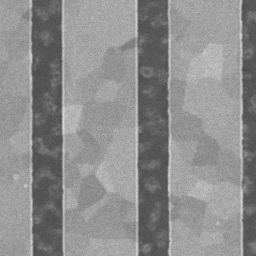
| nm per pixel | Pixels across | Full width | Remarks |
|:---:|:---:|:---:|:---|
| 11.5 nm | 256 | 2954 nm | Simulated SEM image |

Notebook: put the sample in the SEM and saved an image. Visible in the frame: one or a few lines or trenches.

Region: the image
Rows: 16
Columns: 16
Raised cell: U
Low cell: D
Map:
UUDDUUUUUDDUUUUD
UUDDUUUUUDDUUUUD
UUDDUUUUUDDUUUUD
UUDDUUUUUDDUUUUD
UUDDUUUUUDDUUUUD
UUDDUUUUUDDUUUUD
UUDDUUUUUDDUUUUD
UUDDUUUUUDDUUUUD
UUDDUUUUUDDUUUUD
UUDDUUUUUDDUUUUD
UUDDUUUUUDDUUUUD
UUDDUUUUUDDUUUUD
UUDDUUUUUDDUUUUD
UUDDUUUUUDDUUUUD
UUDDUUUUUDDUUUUD
UUDDUUUUUDDUUUUD